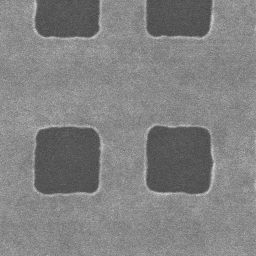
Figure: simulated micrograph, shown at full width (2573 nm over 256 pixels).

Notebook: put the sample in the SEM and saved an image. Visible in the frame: holes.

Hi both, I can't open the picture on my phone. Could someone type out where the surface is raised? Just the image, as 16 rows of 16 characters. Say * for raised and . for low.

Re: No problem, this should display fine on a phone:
**....***....***
**....***....***
****************
****************
****************
****************
****************
****************
**....***....***
**....***....***
**....***....***
**....***....***
****************
****************
****************
****************